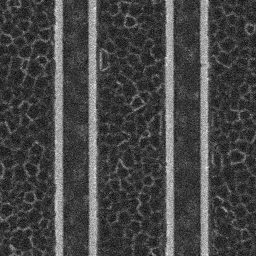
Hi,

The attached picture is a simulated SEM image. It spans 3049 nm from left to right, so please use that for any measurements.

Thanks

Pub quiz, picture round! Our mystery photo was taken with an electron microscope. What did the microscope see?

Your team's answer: one or a few lines or trenches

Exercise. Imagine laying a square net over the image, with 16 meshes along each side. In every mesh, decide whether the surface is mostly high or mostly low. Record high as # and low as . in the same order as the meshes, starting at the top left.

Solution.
####..#####..###
####..#####..###
####..#####..###
####..#####..###
####..#####..###
####..#####..###
####..#####..###
####..#####..###
####..#####..###
####..#####..###
####..#####..###
####..#####..###
####..#####..###
####..#####..###
####..#####..###
####..#####..###